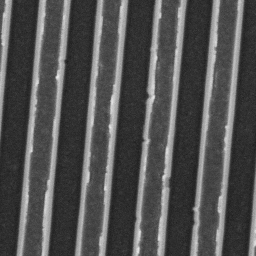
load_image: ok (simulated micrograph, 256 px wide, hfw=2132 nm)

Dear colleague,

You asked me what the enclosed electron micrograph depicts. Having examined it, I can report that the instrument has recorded parallel lines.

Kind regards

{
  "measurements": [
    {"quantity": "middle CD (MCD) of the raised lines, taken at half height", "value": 215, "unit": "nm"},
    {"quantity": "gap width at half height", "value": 269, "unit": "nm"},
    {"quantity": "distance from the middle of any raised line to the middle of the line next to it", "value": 480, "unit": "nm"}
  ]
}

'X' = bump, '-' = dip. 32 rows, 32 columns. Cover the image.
X----XXX-----XXX----XXX----XXX--
X----XXX----XXXX----XXX----XXX--
X----XXX----XXX-----XXX----XXX--
X----XXX----XXX----XXXX----XXX--
X----XXX----XXX----XXXX----XXX--
X----XXX----XXX----XXX-----XXX--
X----XXX----XXX----XXX----XXXX--
-----XXX----XXX----XXX----XXX---
-----XXX----XXX----XXX----XXX---
----XXXX----XXX----XXX----XXX---
----XXXX----XXX----XXX----XXX---
----XXX-----XXX----XXX----XXX---
----XXX----XXX-----XXX----XXX---
----XXX----XXX-----XXX----XXX---
----XXX----XXX----XXXX----XXX---
----XXX----XXX----XXXX----XXX---
----XXX----XXX----XXX----XXXX---
----XXX----XXX----XXX----XXXX---
----XXX----XXX----XXX----XXX----
---XXXX----XXX----XXX----XXX----
---XXXX----XXX----XXX----XXX----
---XXXX----XXX----XXX----XXX----
---XXXX----XXX----XXX----XXX----
---XXX-----XXX----XXX----XXX----
---XXX----XXX-----XXX----XXX----
---XXX----XXX----XXXX----XXX----
---XXX----XXX----XXXX----XXX----
---XXX----XXX----XXXX----XXX----
---XXX----XXX----XXX-----XXX----
---XXX----XXX----XXX----XXXX----
---XXX----XXX----XXX----XXXX----
---XXX----XXX----XXX----XXX-----